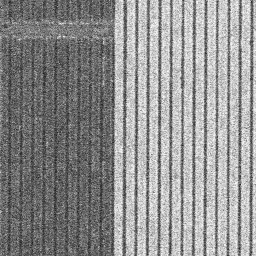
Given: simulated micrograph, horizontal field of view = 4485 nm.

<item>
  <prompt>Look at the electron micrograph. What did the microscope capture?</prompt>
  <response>parallel lines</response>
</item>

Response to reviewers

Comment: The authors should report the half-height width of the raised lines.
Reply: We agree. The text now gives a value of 0.136 um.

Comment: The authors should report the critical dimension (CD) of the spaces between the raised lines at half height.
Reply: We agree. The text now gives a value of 67.9 nm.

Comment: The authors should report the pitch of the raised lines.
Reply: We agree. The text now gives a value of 0.202 micrometres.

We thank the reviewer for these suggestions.